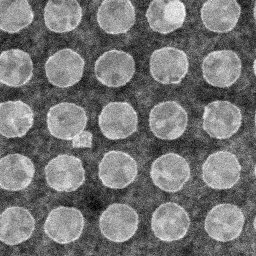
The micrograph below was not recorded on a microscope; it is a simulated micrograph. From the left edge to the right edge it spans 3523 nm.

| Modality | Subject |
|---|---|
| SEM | a regular array of raised bodies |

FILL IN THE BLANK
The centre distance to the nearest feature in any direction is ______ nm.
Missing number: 690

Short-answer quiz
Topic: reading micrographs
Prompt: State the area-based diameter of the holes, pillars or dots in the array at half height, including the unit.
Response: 0.513 um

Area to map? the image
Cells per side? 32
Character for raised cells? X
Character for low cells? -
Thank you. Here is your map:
XXX---XXXX---XXX---XXXX---XXXX--
XXXX--XXXX--XXXXX-XXXXX--XXXXX--
XXXX--XXXX--XXXXX--XXXX--XXXXX--
XXX---XXX----XXX---XXX----XXX---
--------------------------------
--------------------------------
-XX----XX-----X----XXXX----XX---
XXXX--XXXX--XXXXX--XXXX---XXXX--
XXXX--XXXX--XXXXX--XXXX--XXXXX--
XXXX--XXXX--XXXX---XXXX---XXXX--
-XX----XX----XX-----------XXX---
--------------------------------
--------------------------------
XXXX---XXX---XXX---XXXX---XXXX--
XXXX--XXXXX--XXXX--XXXX---XXXX--
XXXX--XXXXX-XXXXX--XXXX--XXXXX--
XXX---XXXXX--XXXX--XXXX---XXX---
---------XX---------------------
--------------------------------
-XX----XX----XXX-----X----XXX---
XXXX--XXXX---XXXX--XXXX---XXXX--
XXXX--XXXX--XXXXX--XXXXX-XXXXX--
XXXX--XXXX---XXXX--XXXX---XXXX--
-XX----XXX----------XX-----X----
--------------------------------
---------------------X----------
-XX---XXXX---XXXX--XXXX---XXXX--
XXXX--XXXX---XXXX--XXXXX--XXXX--
XXXX--XXXX---XXXX--XXXX---XXXX--
XXXX--XXXX---XXX----XXX---XXXX--
-X------------------------------
--------------------------------